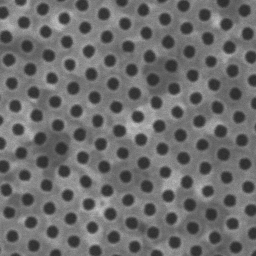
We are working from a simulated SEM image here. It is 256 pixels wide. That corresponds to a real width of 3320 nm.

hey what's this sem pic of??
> a regular array of holes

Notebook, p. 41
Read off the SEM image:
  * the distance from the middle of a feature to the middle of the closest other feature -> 295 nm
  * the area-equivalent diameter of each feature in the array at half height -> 14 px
